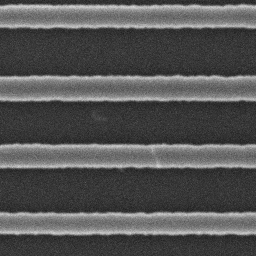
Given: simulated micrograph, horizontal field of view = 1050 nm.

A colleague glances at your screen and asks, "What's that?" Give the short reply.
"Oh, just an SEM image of lines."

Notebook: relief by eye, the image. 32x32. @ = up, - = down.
--------------------------------
@@@@@@@@@@@@@@@@@@@@@@@@@@@@@@@@
@@@@@@@@@@@@@@@@@@@@@@@@@@@@@@@@
--------------------------------
--------------------------------
--------------------------------
--------------------------------
--------------------------------
--------------------------------
--------------------------------
@@@@@@@@@@@@@@@@@@@@@@@@@@@@@@@@
@@@@@@@@@@@@@@@@@@@@@@@@@@@@@@@@
@@@@@@@@@@@@@@@@@@@@@@@@@@@@@@@@
--------------------------------
--------------------------------
--------------------------------
--------------------------------
--------------------------------
@@@@@@@@@@@@@@@@@@@@@@@@@@@@@@@@
@@@@@@@@@@@@@@@@@@@@@@@@@@@@@@@@
@@@@@@@@@@@@@@@@@@@@@@@@@@@@@@@@
--------------------------------
--------------------------------
--------------------------------
--------------------------------
--------------------------------
--------------------------------
@@@@@@@@@@@@@@@@@@@@@@@@@@@@@@@@
@@@@@@@@@@@@@@@@@@@@@@@@@@@@@@@@
--------------------------------
--------------------------------
--------------------------------